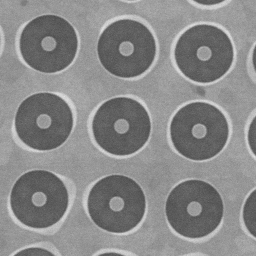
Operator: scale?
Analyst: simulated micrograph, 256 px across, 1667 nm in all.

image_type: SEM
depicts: an array of small figures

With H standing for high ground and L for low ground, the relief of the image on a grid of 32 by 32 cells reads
HHHHHHHHHHHHHHHHHHHHHHHHHLLLHHHH
HHHHHHHHHHHHHHHHHHHHHHHHHHHHHHHH
HHHHLLLLHHHHHHLLLLHHHHHHHHHHHHHH
HHHLLLLLLHHHHLLLLLLHHHHLLLLLHHHH
HHLLLLLLLLHHLLLLLLLHHHLLLLLLLHHH
HHLLLHHLLLHHLLLHLLLLHHLLLLLLLHHH
HHLLLLLLLLHHLLLHHLLLHHLLLHLLLHHL
HHHLLLLLLHHHLLLLLLLHHHLLLHLLLHHL
HHHHLLLLHHHHHLLLLLLHHHLLLLLLLHHL
HHHHHHHHHHHHHHLLLLHHHHHLLLLLHHHH
HHHHHHHHHHHHHHHHHHHHHHHHHHHHHHHH
HHHHHHHHHHHHHHHHHHHHHHHHHHHHHHHH
HHHLLLLLHHHHHHLLLHHHHHHHHHHHHHHH
HHLLLLLLLHHHLLLLLLHHHHHLLLLHHHHH
HHLLLHLLLHHHLLLLLLLHHHLLLLLLHHHH
HHLLLHLLLHHLLLHHLLLHHLLLLLLLLHHL
HHLLLLLLLHHLLLLHLLLHHLLLHHLLLHHL
HHLLLLLLHHHHLLLLLLLHHLLLLLLLHHHL
HHHLLLLHHHHHHLLLLLHHHHLLLLLLHHHL
HHHHHHHHHHHHHHLLHHHHHHHLLLLHHHHH
HHHHHHHHHHHHHHHHHHHHHHHHHHHHHHHH
HHHLLLHHHHHHHHHHHHHHHHHHHHHHHHHH
HHLLLLLLHHHHLLLLLHHHHHHLLHHHHHHH
HHLLLLLLLHHLLLLLLLHHHHLLLLLHHHHH
HLLLHHLLLHHLLLLLLLHHHLLLLLLLHHHL
HLLLHLLLLHHLLLHLLLHHHLLLHLLLHHHL
HLLLLLLLHHHLLLLLLLHHHLLLHLLLHHLL
HHLLLLLLHHHLLLLLLLHHHLLLLLLLHHLL
HHHHLLLHHHHHHLLLLHHHHLLLLLLHHHHL
HHHHHHHHHHHHHHHHHHHHHHHLLLHHHHHH
HHHHHHHHHHHHHHHHHHHHHHHHHHHHHHHH
HHLLLLLHHHHHHLLHHHHHHHHHHHHHHHHH